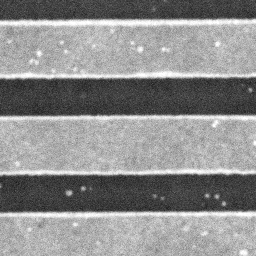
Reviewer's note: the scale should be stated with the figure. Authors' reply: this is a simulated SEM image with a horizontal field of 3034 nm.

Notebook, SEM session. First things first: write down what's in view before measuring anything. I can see lines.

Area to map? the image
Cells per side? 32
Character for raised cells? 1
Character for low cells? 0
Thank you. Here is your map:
00000000000000000000000000000000
00000000000000000000000000000000
00000000000000000000000000000000
11111111111111111111111111111111
11111111111111111111111111111111
11111111111111111111111111111111
11111111111111111111111111111111
11111111111111111111111111111111
11111111111111111111111111111111
11111111111111111111111111111111
00000000000000000000000000000000
00000000000000000000000000000000
00000000000000000000000000000000
00000000000000000000000000000000
00000000000000000000000000000000
11111111111111111111111111111111
11111111111111111111111111111111
11111111111111111111111111111111
11111111111111111111111111111111
11111111111111111111111111111111
11111111111111111111111111111111
11111111111111111111111111111111
00000000000000000000000000000000
00000000000000000000000000000000
00000000000000000000000000000000
00000000000000000000000000000000
00000000000000000000000000000000
11111111111111111111111111111111
11111111111111111111111111111111
11111111111111111111111111111111
11111111111111111111111111111111
11111111111111111111111111111111